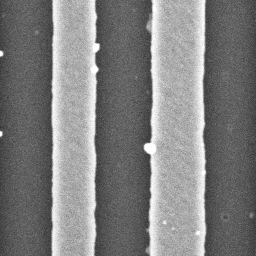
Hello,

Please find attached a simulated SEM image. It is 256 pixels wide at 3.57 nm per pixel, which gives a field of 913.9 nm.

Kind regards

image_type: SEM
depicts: lines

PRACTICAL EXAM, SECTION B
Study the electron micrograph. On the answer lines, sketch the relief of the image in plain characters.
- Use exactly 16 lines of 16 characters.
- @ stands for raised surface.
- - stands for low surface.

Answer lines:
---@@@----@@@---
---@@@----@@@---
---@@@---@@@@---
---@@@---@@@@---
---@@@---@@@@---
---@@@----@@@---
---@@@----@@@---
---@@@---@@@@---
---@@@---@@@@---
---@@@---@@@@---
---@@@---@@@@---
---@@@---@@@@---
---@@@---@@@@---
---@@@---@@@@---
---@@@---@@@@---
---@@@---@@@@---